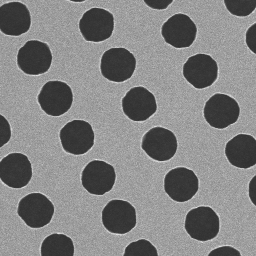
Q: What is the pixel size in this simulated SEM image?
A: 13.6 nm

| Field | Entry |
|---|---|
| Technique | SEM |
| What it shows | a regular array of holes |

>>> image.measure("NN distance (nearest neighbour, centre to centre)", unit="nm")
610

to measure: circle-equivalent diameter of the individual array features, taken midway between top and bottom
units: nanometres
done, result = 470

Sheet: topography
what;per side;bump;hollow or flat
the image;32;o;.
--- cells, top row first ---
o..ooooooooooooooo...ooooooo....
....ooooooo...ooooooooooooooo...
....oooooo....ooooooo...oooooooo
....oooooo....oooooo.....oooooo.
oooooooooo....oooooo....ooooooo.
ooo...ooooooooooooooo...ooooooo.
oo....ooooooo...oooooooooooooooo
oo....ooooooo....oooooo....ooooo
ooo...ooooooo....oooooo....ooooo
ooooooooooooo...ooooooo....ooooo
oooooo..oooooooooooooooo..oooooo
ooooo....ooooooo...ooooooooooooo
ooooo....oooooo....ooooooo...ooo
ooooo....oooooo.....oooooo....oo
oooooooooooooooo...ooooooo....oo
.ooooooo...ooooooooooooooo...ooo
.ooooooo....ooooooo..ooooooooooo
.ooooooo....oooooo....ooooooo...
oooooooo...ooooooo....oooooo....
o..oooooooooooooooo...oooooo....
....ooooooo...ooooooooooooooo...
....oooooo....ooooooo...oooooooo
....oooooo....ooooooo....oooooo.
ooooooooooo...ooooooo....oooooo.
ooo...ooooooooooooooo...ooooooo.
oo.....oooooo...oooooooooooooooo
oo.....oooooo....ooooooo...ooooo
ooo...ooooooo....oooooo....ooooo
ooooooooooooo....oooooo....ooooo
oooooo..oooooooooooooooo...ooooo
ooooo....ooooooo...ooooooooooooo
ooooo....ooooooo....oooooo....oo